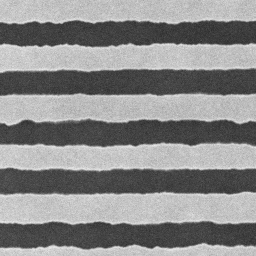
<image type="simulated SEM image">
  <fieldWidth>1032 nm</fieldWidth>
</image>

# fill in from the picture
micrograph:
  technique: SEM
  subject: lines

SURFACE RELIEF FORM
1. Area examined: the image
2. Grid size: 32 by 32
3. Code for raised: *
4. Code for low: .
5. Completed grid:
********************************
********************************
*********.**********************
................................
................................
................................
********************************
********************************
********************************
................................
................................
................................
********************************
********************************
********************************
.*..............................
................................
................................
********************************
********************************
********************************
................................
................................
................................
********************************
********************************
********************************
********************************
................................
................................
.........................*......
********************************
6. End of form